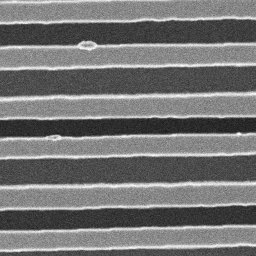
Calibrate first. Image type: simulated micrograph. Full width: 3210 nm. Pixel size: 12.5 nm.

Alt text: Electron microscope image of lines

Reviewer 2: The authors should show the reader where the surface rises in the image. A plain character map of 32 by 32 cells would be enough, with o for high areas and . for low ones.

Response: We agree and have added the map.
oooooooooooooooooooooooooooooooo
oooooooooooooooooooooooooooooooo
oooooooooooooooooo.oo...........
................................
................................
..........oo....................
oooooooooooooooooooooooooooooooo
oooooooooooooooooooooooooooooooo
ooo...oo........................
................................
................................
................................
oooooooooooooooooooooooooooooooo
oooooooooooooooooooooooooooooooo
oooooooooooooooooooooooooooooooo
................................
................................
oooooooooooooooooooooooooooooooo
oooooooooooooooooooooooooooooooo
oooooooooooooo..................
................................
................................
................................
oooooooooooooooooooooooooooooooo
oooooooooooooooooooooooooooooooo
oooooooooooooooooooooooooooooooo
................................
................................
......................oooooooooo
oooooooooooooooooooooooooooooooo
oooooooooooooooooooooooooooooooo
................................